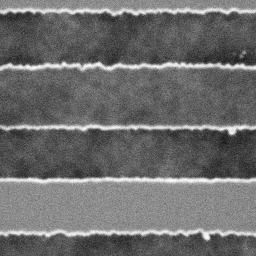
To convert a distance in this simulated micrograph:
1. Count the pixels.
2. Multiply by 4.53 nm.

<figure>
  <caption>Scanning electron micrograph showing lines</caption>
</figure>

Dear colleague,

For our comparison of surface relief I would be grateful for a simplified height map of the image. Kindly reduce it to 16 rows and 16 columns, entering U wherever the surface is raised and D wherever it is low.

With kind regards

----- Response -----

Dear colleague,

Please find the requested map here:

UUUUUUUUUUUUUUUU
DDDDDDDDDDDDDDDD
DDDDDDDDDDDDDDDD
DDDDDDDDDDDDDDDD
UUUUUUUUUUUUUUUU
UUUUUUUUUUUUUUUU
UUUUUUUUUUUUUUUU
UUUUUUUUUUUUUUUU
DDDDDDDDDDDDDDDD
DDDDDDDDDDDDDDDD
DDDDDDDDDDDDDDDD
UUUUUUUUUUUUUUUU
UUUUUUUUUUUUUUUU
UUUUUUUUUUUUUUUU
UUUUUUUUUUUUUUUU
DDDDDDDDDDDDDDDD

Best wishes